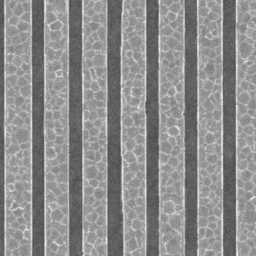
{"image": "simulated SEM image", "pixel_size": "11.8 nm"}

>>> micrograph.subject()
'parallel lines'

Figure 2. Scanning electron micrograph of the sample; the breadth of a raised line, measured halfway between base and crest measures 289 nm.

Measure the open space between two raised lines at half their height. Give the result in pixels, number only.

14.1